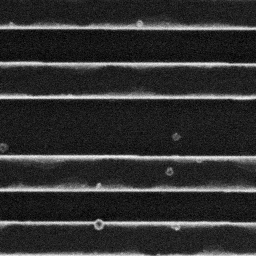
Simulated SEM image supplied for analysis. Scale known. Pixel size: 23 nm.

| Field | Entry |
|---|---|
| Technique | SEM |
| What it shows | lines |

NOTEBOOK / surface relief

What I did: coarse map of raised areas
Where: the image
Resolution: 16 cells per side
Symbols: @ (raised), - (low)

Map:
@@@@@@@@@@@@@@@@
@@@@@@@@@@@@@@@@
----------------
----------------
@@@@@@@@@@@@@@@@
@@@@@@@@@@@@@@@@
----------------
----------------
----------------
----------------
@@@@@@@@@@@@@@@@
@@@@@@@@@@@@@@@@
----------------
----------------
@@@@@@@@@@@@@@@@
@@@@@@@@@@@@@@@@